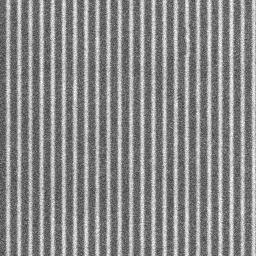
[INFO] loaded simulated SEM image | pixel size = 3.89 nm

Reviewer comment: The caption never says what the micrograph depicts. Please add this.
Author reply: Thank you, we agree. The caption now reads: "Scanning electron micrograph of parallel lines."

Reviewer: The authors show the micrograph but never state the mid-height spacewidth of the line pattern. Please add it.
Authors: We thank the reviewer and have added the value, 31.6 nanometres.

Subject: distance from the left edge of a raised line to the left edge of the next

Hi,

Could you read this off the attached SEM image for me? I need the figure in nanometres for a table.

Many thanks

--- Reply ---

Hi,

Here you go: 43.4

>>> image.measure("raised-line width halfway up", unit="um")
0.0126